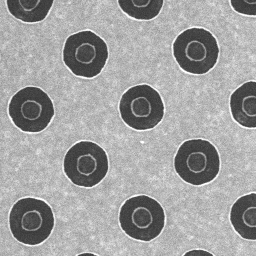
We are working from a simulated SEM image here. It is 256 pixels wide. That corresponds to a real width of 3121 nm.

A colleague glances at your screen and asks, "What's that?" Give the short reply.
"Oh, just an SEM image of a regular array of ring-shaped grooves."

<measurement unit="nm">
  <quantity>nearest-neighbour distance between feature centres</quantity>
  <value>944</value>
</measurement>